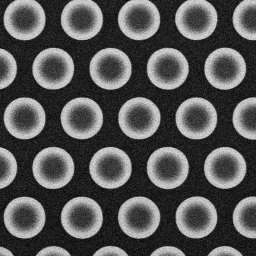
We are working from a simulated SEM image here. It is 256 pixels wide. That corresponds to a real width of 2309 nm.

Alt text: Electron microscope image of an array of small figures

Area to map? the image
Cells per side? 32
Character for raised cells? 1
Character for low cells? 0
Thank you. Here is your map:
01111000111100001110000111000011
01111000111110011111001111100111
01111100111110011111001111100111
01111000111110011111001111100111
00111000011100001110000111000011
00000000000000000000000000000000
10000111000011100001110000011100
11001111100111110001111000111100
11001111100111110011111100111110
11001111100111110001111000111110
10000111000011110001111000111100
00000000000000000000000000000000
00110000011000001110000111000001
01111000111110011111001111100111
01111100111110011111001111100111
01111100111110011111001111100111
01111000111100011110000111100011
00000000000000000000000000000000
00000010000001100000110000011000
11000111100011110001111000111100
11001111100111110011111100111110
11001111100111110011111100111110
11000111100011110001111000111100
00000010000001000000110000011000
00000000000000000000000000000000
01111000111100011110000111100011
01111100111110011111001111100111
01111100111110011111001111100111
01111000111110011111001111100111
00110000011000001110000111000001
00000000000000000000000000000000
10000111000011110001111000111100